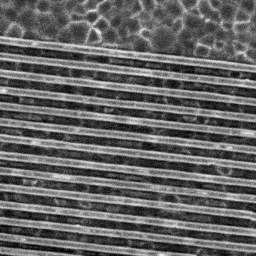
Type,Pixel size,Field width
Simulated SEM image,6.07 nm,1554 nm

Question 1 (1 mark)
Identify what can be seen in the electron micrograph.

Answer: parallel lines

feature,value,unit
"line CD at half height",41.4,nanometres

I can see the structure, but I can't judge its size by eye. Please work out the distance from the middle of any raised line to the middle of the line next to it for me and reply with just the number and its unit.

98.6 nm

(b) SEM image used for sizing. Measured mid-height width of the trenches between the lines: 57.2 nm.